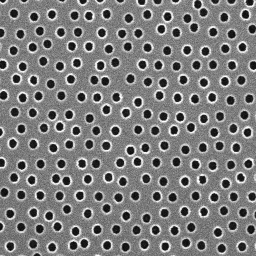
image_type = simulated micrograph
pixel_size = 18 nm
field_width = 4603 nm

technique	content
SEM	a regular array of holes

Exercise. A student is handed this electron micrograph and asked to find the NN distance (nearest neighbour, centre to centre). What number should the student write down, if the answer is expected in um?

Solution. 0.29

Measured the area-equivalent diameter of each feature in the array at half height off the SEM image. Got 0.156 µm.